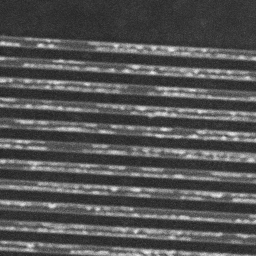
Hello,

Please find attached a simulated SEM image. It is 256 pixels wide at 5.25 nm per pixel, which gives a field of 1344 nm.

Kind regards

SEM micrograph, parallel lines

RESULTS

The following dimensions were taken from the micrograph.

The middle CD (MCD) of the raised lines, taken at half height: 0.0459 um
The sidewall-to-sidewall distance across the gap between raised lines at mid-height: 60.9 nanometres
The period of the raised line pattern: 20.4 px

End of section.